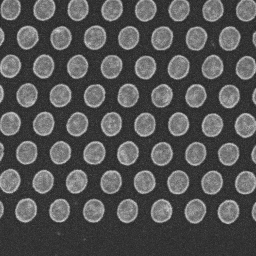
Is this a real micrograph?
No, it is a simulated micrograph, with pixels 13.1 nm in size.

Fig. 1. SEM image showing a regular array of raised bodies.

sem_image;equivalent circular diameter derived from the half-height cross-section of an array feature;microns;0.277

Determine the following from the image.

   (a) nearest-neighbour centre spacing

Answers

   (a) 33.1 px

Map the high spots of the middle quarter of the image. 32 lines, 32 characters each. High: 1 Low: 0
01111100001111000011111000111110
01111100001111000011111000111110
00111000001111000011110000111100
00000000000000000000100000001000
00000000000000000000000000000000
00000001100000011000000011000000
10000011110000111100000111100001
10000111110000111110001111100001
10000111110000111100001111100001
10000011100000111100001111100001
00000001000000011000000010000000
00000000000000000000000000000000
00010000000110000000100000001100
00111100001111000011110000011110
01111100011111000011111000111110
01111100011111000011111000111110
01111000001111000011110000111110
00110000000110000001110000011100
00000000000000000000000000000000
00000000000000001000000000000000
10000011110000111100000111000000
10000111110000111100001111100001
10000111110000111100001111100001
10000111110000111100001111100001
00000011100000111000000111000001
00000000000000000000000000000000
00000000000000000000000000000000
00111000001111000011110000011100
01111000011111000011111000111110
01111000011111000011111000111110
01111000011111000011111000111110
01111000001110000011110000011100